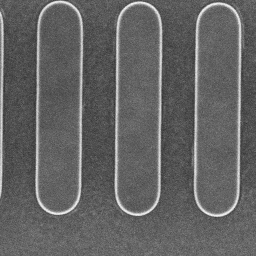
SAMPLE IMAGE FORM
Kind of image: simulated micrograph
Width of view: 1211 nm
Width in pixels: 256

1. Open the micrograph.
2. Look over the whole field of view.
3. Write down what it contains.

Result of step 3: groups of lines, slits or small figures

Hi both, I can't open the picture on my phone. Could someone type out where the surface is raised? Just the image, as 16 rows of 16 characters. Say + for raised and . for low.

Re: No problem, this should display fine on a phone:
...++...++...+..
..+++..+++..+++.
..+++..+++..+++.
..+++..+++..+++.
..+++..+++..+++.
..+++..+++..+++.
..+++..+++..+++.
..+++..+++..+++.
..+++..+++..+++.
..+++..+++..+++.
..+++..+++..+++.
..+++..+++..+++.
..+++..+++..+++.
................
................
................